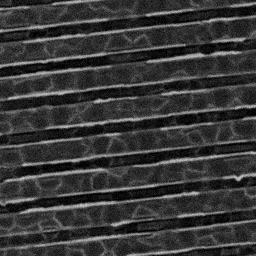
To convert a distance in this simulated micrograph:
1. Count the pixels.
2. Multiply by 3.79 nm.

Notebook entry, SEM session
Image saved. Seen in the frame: parallel lines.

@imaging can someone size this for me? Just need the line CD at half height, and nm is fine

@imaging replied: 87.6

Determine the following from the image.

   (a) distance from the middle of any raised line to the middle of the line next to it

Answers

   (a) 129 nm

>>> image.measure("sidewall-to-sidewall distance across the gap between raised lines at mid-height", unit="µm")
0.0391